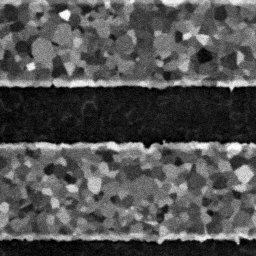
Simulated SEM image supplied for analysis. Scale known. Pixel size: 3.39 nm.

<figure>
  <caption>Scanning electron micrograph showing one or a few lines or trenches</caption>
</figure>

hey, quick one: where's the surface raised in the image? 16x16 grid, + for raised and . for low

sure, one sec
++++++++++++++++
++++++++++++++++
++++++++++++++++
++++++++++++++++
++++++++++++++++
................
................
................
................
++++++++++++++++
++++++++++++++++
++++++++++++++++
++++++++++++++++
++++++++++++++++
++++++++++++++++
................